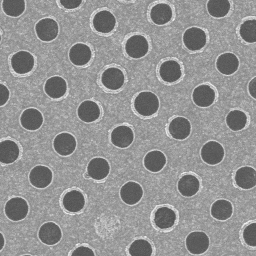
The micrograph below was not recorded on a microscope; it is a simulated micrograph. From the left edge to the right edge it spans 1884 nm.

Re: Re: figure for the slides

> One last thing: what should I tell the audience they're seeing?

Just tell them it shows a regular array of holes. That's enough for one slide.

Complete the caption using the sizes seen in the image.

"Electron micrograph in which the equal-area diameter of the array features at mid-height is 172 nanometers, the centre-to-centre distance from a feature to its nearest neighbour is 0.296 micrometres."